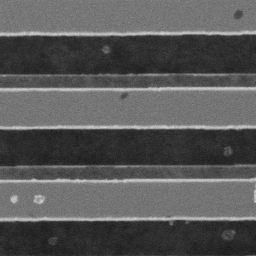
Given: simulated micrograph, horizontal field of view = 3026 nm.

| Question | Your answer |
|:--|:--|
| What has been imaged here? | lines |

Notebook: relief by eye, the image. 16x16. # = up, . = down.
################
################
................
................
................
################
################
################
................
................
################
################
################
################
................
................